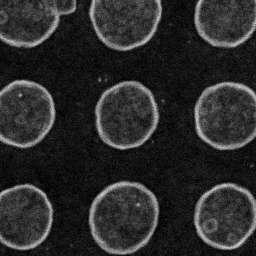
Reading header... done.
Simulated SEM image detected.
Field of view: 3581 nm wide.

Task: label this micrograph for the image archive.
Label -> raised bodies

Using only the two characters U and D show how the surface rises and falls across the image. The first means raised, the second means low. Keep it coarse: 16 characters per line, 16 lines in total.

UUUUDDUUUUDDUUUU
UUUDDDUUUUDDUUUU
UUUDDDDUUDDDDUUD
DDDDDDDDDDDDDDDD
DDDDDDDDDDDDDDDD
UUUDDDDUUDDDDUUD
UUUDDDUUUUDDUUUU
UUUDDDUUUUDDUUUU
UUUDDDUUUDDDDUUU
DDDDDDDDDDDDDDDD
DDDDDDDDDDDDDDDD
DDDDDDDDDDDDDDDD
UUUDDDUUUUDDDUUU
UUUDDDUUUUDDUUUU
UUUDDDUUUDDDUUUU
DUDDDDDUUDDDDDDD